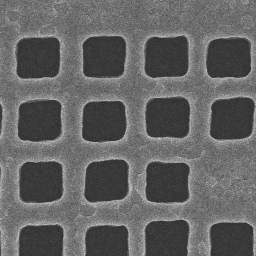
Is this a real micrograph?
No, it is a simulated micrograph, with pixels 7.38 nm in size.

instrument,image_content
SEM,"a regular array of holes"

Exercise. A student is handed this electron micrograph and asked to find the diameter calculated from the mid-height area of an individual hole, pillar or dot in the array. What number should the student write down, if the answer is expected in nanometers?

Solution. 338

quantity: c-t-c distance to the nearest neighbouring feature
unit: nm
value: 449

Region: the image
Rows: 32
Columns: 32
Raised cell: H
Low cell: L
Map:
HHHHHHHHHHHHHHHHHHHHHHHHHHHHHHHH
HHHHHHHHHHHHHHHHHHHHHHHHHHHHHHHH
HHHHHHHHHHHHHHHHHHHHHHHHHHHHHHHH
HHHHHHHHHHHHHHHHHHHHHHHHHHHHHHHH
HHHHHHHHHHHHHLLHHHHHHHLHHHHHHHHH
HHLLLLLLHHLLLLLLHHLLLLLHHHLLLLLH
HHLLLLLLHHLLLLLLHHLLLLLLHHLLLLLH
HHLLLLLLHHLLLLLLHHLLLLLLHHLLLLLH
HHLLLLLHHHLLLLLHHHLLLLLHHHLLLLLH
HHLLLLLHHHHLLLLHHHHLLLLHHHLLLLLH
HHHHHHHHHHHHHHHHHHHHHHHHHHHHHHHH
HHHHHHHHHHHHHHHHHHHHHHHHHHHHHHHH
HHHHHHLHHHHHHHHHHHHLLLLHHHHLLLLH
HHLLLLLLHHLLLLLLHHLLLLLLHHLLLLLL
HHLLLLLLHHLLLLLLHHLLLLLLHHLLLLLL
HHLLLLLLHHLLLLLLHHLLLLLLHHLLLLLL
HHLLLLLLHHLLLLLLHHLLLLLLHHLLLLLH
HHHLLLHHHHHLLLLHHHHHHHHHHHHHHHHH
HHHHHHHHHHHHHHHHHHHHHHHHHHHHHHHH
HHHHHHHHHHHHHHHHHHHHHHHHHHHHHHHH
HHHLLLLHHHHLLLLLHHHLLLLHHHHHHHHH
HHLLLLLLHHHLLLLLHHLLLLLLHHHHHHHH
HHLLLLLLHHHLLLLLHHLLLLLLHHHHHHHH
HHLLLLLLHHHLLLLLHHLLLLLLHHHHHHHH
HHLLLLLLHHHLLLLLHHLLLLLLHHHHHHHH
HHHHHHHHHHHHHHHHHHHHHHHHHHHHHHHH
HHHHHHHHHHHHHHHHHHHHHHHHHHHHHHHH
HHHHHHHHHHHHHHHHHHHHHHHHHHHHHHHH
HHHLLLLLHHHLLLLLHHLLLLLLHHLLLLLL
HHLLLLLLHHHLLLLLHHLLLLLLHHLLLLLL
HHLLLLLLHHHLLLLLHHLLLLLHHHLLLLLL
HHLLLLLLHHHLLLLLHHLLLLLHHHLLLLLL